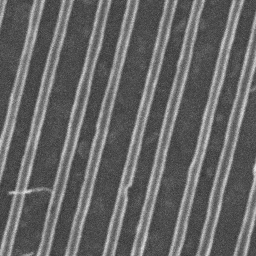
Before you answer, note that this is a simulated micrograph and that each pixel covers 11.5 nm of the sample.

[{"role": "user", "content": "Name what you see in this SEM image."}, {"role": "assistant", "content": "parallel lines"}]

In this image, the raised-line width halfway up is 111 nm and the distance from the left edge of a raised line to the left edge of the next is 0.365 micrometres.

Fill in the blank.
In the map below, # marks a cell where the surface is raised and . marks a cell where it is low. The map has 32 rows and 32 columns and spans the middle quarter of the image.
.....###....###.......##....###.
.....##.....##.......###....###.
.....##.....##.......###....###.
....###.....##.......##.....##..
....###....###.......##.....##..
....###....##.......###....###..
...###.....##.......###....###..
...###....###.......##.....##...
...###....###.......##....###...
...###....###......###....###...
..####...###.......##.....###...
..###....###.......##.....##....
..###....###.......##....###....
..###....##.......###....###....
.####....##.......##.....###....
.###....###.......##.....##.....
.###....###.......##....###.....
.###....###......###....###.....
.##.....##.......##.....###.....
###....###.......##.....##......
###....###.......##.....##......
###....###......###....###......
##.....##.......###....##.......
##....###.......##.....##.......
##....###.......##.....##.......
##....##.......###....###.......
#.....##.......###....###......#
#....###.......##.....##.......#
#....###.......##.....##.......#
#....###......###....###.......#
.....##.......##.....###.......#
....###.......##.....##.......##